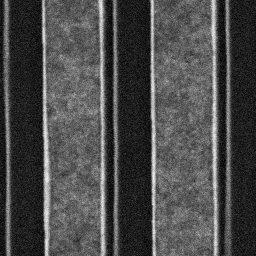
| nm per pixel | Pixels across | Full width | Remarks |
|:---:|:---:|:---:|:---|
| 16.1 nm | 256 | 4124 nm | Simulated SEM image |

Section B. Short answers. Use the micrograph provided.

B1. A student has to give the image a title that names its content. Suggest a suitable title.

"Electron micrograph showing lines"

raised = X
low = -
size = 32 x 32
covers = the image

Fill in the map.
-----XXXXXXXX------XXXXXXXX-----
-----XXXXXXXX------XXXXXXXX-----
-----XXXXXXXX------XXXXXXXX-----
-----XXXXXXXX------XXXXXXXX-----
-----XXXXXXXX------XXXXXXXX-----
-----XXXXXXXX------XXXXXXXX-----
-----XXXXXXXX------XXXXXXXX-----
-----XXXXXXXX------XXXXXXXX-----
-----XXXXXXXX------XXXXXXXX-----
-----XXXXXXXX------XXXXXXXX-----
-----XXXXXXXX------XXXXXXXX-----
-----XXXXXXXX------XXXXXXXX-----
-----XXXXXXXX------XXXXXXXX-----
-----XXXXXXXX------XXXXXXXX-----
-----XXXXXXXX------XXXXXXXX-----
------XXXXXXX------XXXXXXXX-----
------XXXXXXX------XXXXXXXX-----
------XXXXXXX------XXXXXXXX-----
------XXXXXXX------XXXXXXXX-----
------XXXXXXX------XXXXXXXX-----
------XXXXXXX------XXXXXXXX-----
------XXXXXXX------XXXXXXXX-----
------XXXXXXX------XXXXXXXX-----
------XXXXXXX------XXXXXXXX-----
------XXXXXXX------XXXXXXXX-----
------XXXXXXX------XXXXXXXX-----
------XXXXXXX------XXXXXXXX-----
------XXXXXXX------XXXXXXXX-----
------XXXXXXX------XXXXXXXX-----
------XXXXXXX------XXXXXXXX-----
------XXXXXXX------XXXXXXXX-----
------XXXXXXX------XXXXXXXX-----